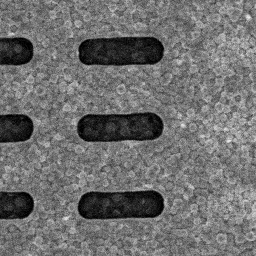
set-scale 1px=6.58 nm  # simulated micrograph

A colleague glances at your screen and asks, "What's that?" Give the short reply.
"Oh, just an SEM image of holes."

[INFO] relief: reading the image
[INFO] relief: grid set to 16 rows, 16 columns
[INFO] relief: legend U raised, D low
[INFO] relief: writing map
UUUUUUUUUUUUUUUU
UUUUUUUUUUUUUUUU
DDUUUDDDDDUUUUUU
DDUUUDDDDDUUUUUU
UUUUUUUUUUUUUUUU
UUUUUUUUUUUUUUUU
UUUUUUUUUUUUUUUU
DDUUUDDDDDUUUUUU
DDUUUDDDDDUUUUUU
UUUUUUUUUUUUUUUU
UUUUUUUUUUUUUUUU
UUUUUUUUUUUUUUUU
DDUUUDDDDDUUUUUU
DDUUUDDDDDUUUUUU
UUUUUUUUUUUUUUUU
UUUUUUUUUUUUUUUU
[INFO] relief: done